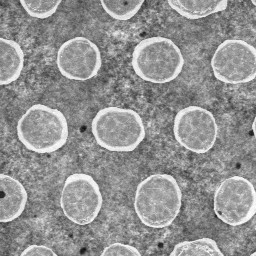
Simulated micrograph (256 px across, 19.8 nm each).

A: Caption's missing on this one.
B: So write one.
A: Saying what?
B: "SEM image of raised bodies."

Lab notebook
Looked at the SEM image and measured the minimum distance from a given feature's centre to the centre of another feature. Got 1540 nanometers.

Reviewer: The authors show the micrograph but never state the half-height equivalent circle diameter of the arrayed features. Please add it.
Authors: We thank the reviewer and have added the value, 894 nanometers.